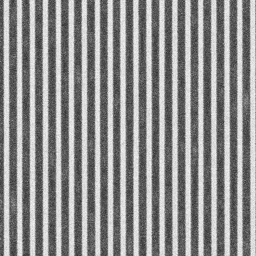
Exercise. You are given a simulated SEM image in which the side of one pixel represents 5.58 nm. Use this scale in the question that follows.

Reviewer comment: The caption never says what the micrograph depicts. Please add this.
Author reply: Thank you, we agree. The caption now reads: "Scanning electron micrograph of parallel lines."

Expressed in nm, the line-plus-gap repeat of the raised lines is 72.3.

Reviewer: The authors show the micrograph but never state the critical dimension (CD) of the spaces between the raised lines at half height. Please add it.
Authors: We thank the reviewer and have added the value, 47.4 nm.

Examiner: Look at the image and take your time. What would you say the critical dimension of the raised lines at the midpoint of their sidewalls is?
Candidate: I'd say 23.7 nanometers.